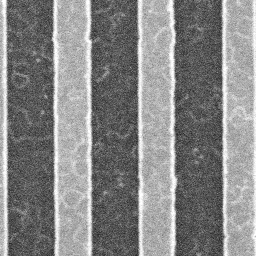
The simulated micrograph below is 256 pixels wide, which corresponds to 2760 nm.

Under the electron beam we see one or a few lines or trenches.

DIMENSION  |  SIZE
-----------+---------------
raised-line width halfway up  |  344 nm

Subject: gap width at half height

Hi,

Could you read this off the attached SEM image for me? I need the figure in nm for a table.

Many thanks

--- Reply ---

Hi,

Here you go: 548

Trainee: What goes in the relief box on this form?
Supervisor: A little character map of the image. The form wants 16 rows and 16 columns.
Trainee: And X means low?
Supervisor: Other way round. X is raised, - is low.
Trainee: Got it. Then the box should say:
---XXX---XX---XX
---XXX---XX---XX
---XXX---XX---XX
---XXX---XX---XX
----XX---XX---XX
----XX---XX---XX
---XXX---XX---XX
----XX---XX---XX
----XX---XX---XX
----XX---XX---XX
----XX---XX---XX
---XXX---XX---XX
---XXX---XX---XX
----XX---XX---XX
----XX---XX---XX
----XX---XX---XX